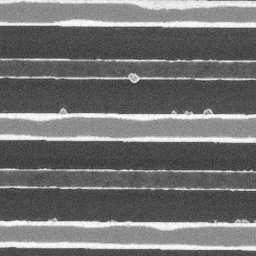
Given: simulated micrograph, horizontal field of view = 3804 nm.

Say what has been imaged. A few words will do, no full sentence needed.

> lines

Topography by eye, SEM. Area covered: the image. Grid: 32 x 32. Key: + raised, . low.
+++++++++++++++++++....+++++++++
++++++++++++++++++++++++++++++++
++++++++++++++++++++++++++++++++
................................
................................
................................
................................
+++++++++.......................
++++++++++++++++++++++++++++++++
++++++++++++++++++++++++++++++++
................................
................................
................................
................................
++++..++++++++++....+++..+++...+
++++++++++++++++++++++++++++++++
++++++++++++++++++++++++++++++++
...............++.....++++++++++
................................
................................
................................
++++++++++++++++++++++++++++++..
++++++++++++++++++++++++++++++++
........++++++++++++++++++++++++
................................
................................
................................
................................
++++++++++++++++++++++++++++++++
++++++++++++++++++++++++++++++++
++++++++++++++++++++++++++++++++
................................